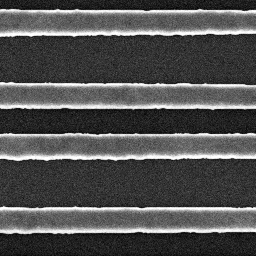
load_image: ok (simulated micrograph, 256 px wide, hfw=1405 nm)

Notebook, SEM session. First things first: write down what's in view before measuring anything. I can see lines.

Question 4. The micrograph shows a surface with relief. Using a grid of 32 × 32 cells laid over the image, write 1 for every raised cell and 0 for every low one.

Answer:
00000000000000000000000000000000
11111111111111111111111111111111
11111111111111111111111111111111
11111111111111111111111111111111
00000000000000000000000000000000
00000000000000000000000000000000
00000000000000000000000000000000
00000000000000000000000000000000
00000000000000000000000000000000
00000000000000000000000000000000
11111111111111111101001101000000
11111111111111111111111111111111
11111111111111111111111111111111
11111111111111111111111111111111
00000000000000000000000000000000
00000000000000000000000000000000
00000000000000000000000000000000
11111111111111111111111111111111
11111111111111111111111111111111
11111111111111111111111111111111
00000000000000000000000000000000
00000000000000000000000000000000
00000000000000000000000000000000
00000000000000000000000000000000
00000000000000000000000000000000
00000000000000000000000000000000
11111111111111111111111111111111
11111111111111111111111111111111
11111111111111111111111111111111
00000000000000000000000000000000
00000000000000000000000000000000
00000000000000000000000000000000